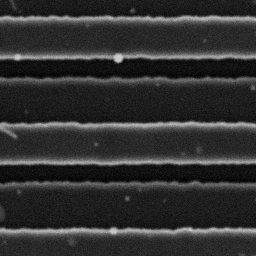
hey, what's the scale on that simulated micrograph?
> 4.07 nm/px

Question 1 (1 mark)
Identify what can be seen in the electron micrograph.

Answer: lines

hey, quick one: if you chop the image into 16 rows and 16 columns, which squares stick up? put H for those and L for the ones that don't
LLLLLLLLLLLLLLLL
HHHHHHHHHHHHHHHH
HHHHHHHHHHHHHHHH
HHHHHHHHHHHHHHHH
LLLLLLLLLLLLLLLL
LLLLLLLLLLLLLLLL
LLLLLLLLLLLLLLLL
LLLLLLLLLLLLLLLL
HHHHHHHHHHHHHHHH
HHHHHHHHHHHHHHHH
LLLLLLLLLLLLLLLL
LLLLLLLLLLLLLLLL
LLLLLLLLLLLLLLLL
LLLLLLLLLLLLLLLL
HHHHHHHHHHHHHHHH
HHHHHHHHHHHHHHHH